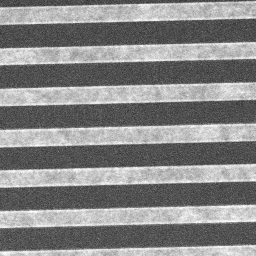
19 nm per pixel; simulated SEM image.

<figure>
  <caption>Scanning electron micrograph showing parallel lines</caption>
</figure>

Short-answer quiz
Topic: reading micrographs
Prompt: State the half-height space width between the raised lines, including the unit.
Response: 0.484 um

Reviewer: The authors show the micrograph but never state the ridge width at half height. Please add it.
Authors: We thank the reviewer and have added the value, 297 nanometres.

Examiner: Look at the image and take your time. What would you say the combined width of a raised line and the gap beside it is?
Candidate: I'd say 773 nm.